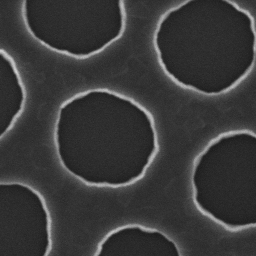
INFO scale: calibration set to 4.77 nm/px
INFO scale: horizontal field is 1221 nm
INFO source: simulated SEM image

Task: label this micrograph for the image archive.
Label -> holes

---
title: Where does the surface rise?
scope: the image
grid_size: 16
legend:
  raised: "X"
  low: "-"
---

XX------XXX----X
XX------XX------
XXX----XXX------
XXXXXXXXXX------
-XXXXXXXXXX----X
-XXXXXXXXXXX--XX
-XXX----XXXXXXXX
-XXX-----XXXXXXX
XXXX------XXXX--
XXXX------XXX---
XXXX-----XXX----
XXXXXXX-XXXX----
--XXXXXXXXXX----
---XXXXXXXXXX---
---XXXX---XXXXXX
---XXX-----XXXXX